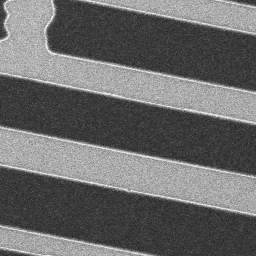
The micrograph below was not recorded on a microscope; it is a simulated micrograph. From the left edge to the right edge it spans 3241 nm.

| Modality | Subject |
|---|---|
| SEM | one or a few lines or trenches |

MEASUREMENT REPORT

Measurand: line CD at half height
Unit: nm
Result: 750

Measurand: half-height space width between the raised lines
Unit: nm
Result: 363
